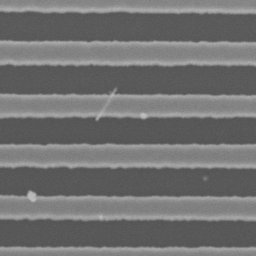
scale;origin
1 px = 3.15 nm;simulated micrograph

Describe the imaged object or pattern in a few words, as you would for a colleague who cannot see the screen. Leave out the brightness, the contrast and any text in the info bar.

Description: lines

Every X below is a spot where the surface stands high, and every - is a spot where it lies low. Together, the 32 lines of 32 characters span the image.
XXXXXXXXXXXXXXXXXXXXXXXXXXXXXXXX
-------X--X-X----XX-XXXXXXXXXXXX
--------------------------------
--------------------------------
--------------------------------
XXXXXXXXXXXXXXXXXXXXXXXXXXXXXXXX
XXXXXXXXXXXXXXXXXXXXXXXXXXXXXXXX
XXXXXXXXXXXXXXXXXXXXXXXXXXXXXXXX
--------------------------------
--------------------------------
--------------------------------
--------------------------------
XXXXXXXXXXXXXXXXXXXXXXXXXXXXXXXX
XXXXXXXXXXXXXXXXXXXXXXXXXXXXXXXX
XXXXXXXXXXXXXXXXXXXXXXXXXXXXXXXX
--------------------------------
--------------------------------
--------------------------------
XXXXXXXXXXXXXXXXXXXXXXXXXXXXXXXX
XXXXXXXXXXXXXXXXXXXXXXXXXXXXXXXX
XXXXXXXXXXXXXXXXXXXXXXXXXXXXXXXX
--------------------------------
--------------------------------
--------------------------------
XX-XX------X--------------------
XXXXXXXXXXXXXXXXXXXXXXXXXXXXXXXX
XXXXXXXXXXXXXXXXXXXXXXXXXXXXXXXX
-------------------------------X
--------------------------------
--------------------------------
--------------------------------
XXXXXXXXXXXXXXXXXXXXXXXXXXXXXXXX